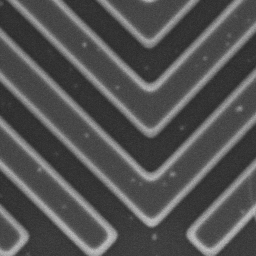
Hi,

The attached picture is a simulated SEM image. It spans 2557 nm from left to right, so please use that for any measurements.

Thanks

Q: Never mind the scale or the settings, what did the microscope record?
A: groups of lines, slits or small figures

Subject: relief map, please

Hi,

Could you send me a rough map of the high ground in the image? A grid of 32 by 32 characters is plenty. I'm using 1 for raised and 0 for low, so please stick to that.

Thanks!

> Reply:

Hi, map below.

00111111000001111111111100000111
00011111100000111111111000001111
00001111110000011111110000011111
00000111111000001111100000111111
00000011111100000111000001111110
10000001111110000010000001111100
11000000111111000000000011111000
11110000011111100000001111110000
11111000001111110000011111100000
11111100000111111000011111000000
01111110000011111100111110000001
00111111000001111111111100000011
00011111100000111111111000000111
00001111110000011111110000001111
00000111111000001111100000011111
00000011111100000111000000111110
10000001111110000010000001111100
11000000111111000000000011111000
11110000011111100000000111110000
11111000001111110000001111100000
11111100000111111000011111000000
01111110000011111100111111000001
00111111000001111111111110000011
00011111100000111111111100000111
00001111110000011111111000001111
00000111111000001111110000011111
00000011111100000111100000111111
10000001111110000011000001111110
11000000111111000000000011111100
11100000011111000000000011111000
11100000001110000000000001110000
11000000000110000000000000100000